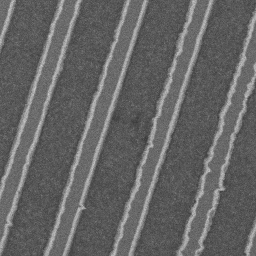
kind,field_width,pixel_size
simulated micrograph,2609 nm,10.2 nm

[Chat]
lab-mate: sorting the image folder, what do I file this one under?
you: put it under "one or a few lines or trenches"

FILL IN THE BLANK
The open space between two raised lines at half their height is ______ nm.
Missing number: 477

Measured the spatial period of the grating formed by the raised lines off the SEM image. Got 642 nanometres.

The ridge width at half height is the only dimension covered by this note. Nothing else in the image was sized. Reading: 159 nm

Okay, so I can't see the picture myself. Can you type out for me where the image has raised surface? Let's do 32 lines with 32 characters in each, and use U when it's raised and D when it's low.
UDDDDDDDUUDDDDDDUUDDDDDDUUDDDDDD
UDDDDDDUUDDDDDDDUUDDDDDDUUDDDDDD
UDDDDDDUUDDDDDDUUDDDDDDDUUDDDDDD
UDDDDDDUUDDDDDDUUDDDDDDUUDDDDDDU
DDDDDDUUDDDDDDDUUDDDDDDUUDDDDDDU
DDDDDDUUDDDDDDUUDDDDDDDUUDDDDDDU
DDDDDDUUDDDDDDUUDDDDDDUUDDDDDDDU
DDDDDUUUDDDDDDUUDDDDDDUUDDDDDDUU
DDDDDUUDDDDDDUUUDDDDDDUUDDDDDDUU
DDDDDUUDDDDDDUUDDDDDDUUDDDDDDDUU
DDDDUUUDDDDDDUUDDDDDDUUDDDDDDUUD
DDDDUUDDDDDDUUUDDDDDDUUDDDDDDUUD
DDDDUUDDDDDDUUDDDDDDUUDDDDDDDUUD
DDDUUUDDDDDDUUDDDDDDUUDDDDDDUUDD
DDDUUDDDDDDUUUDDDDDDUUDDDDDDUUDD
DDDUUDDDDDDUUDDDDDDUUUDDDDDDUUDD
DDDUUDDDDDDUUDDDDDDUUDDDDDDDUDDD
DDUUDDDDDDUUUDDDDDDUUDDDDDDUUDDD
DDUUDDDDDDUUDDDDDDDUUDDDDDDUUDDD
DDUUDDDDDDUUDDDDDDUUDDDDDDUUUDDD
DUUDDDDDDUUUDDDDDDUUDDDDDDUUDDDD
DUUDDDDDDUUDDDDDDDUDDDDDDDUUDDDD
UUUDDDDDDUUDDDDDDUUDDDDDDUUUDDDD
UUDDDDDDDUUDDDDDDUUDDDDDDUUDDDDD
UUDDDDDDUUDDDDDDDUUDDDDDDUUDDDDD
UUDDDDDDUUDDDDDDUUDDDDDDDUUDDDDD
UDDDDDDDUUDDDDDDUUDDDDDDUUDDDDDD
UDDDDDDUUDDDDDDDUUDDDDDDUUDDDDDD
UDDDDDDUUDDDDDDUUDDDDDDDUUDDDDDD
UDDDDDDUUDDDDDDUUDDDDDDUUDDDDDDD
DDDDDDUUUDDDDDDUUDDDDDDUUDDDDDDU
DDDDDDUUDDDDDDUUDDDDDDDUUDDDDDDU